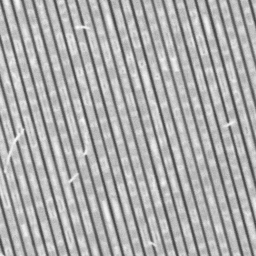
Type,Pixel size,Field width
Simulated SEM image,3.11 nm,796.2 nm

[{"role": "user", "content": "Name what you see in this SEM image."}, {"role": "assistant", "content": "parallel lines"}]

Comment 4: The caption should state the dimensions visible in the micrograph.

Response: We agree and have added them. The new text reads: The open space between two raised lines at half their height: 0.0083 µm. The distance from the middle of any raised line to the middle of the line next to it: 32.5 nm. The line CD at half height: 22.2 nanometers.